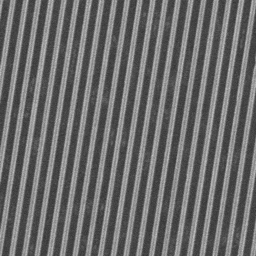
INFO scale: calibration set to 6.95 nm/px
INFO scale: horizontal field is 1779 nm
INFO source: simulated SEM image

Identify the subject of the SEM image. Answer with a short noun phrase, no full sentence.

parallel lines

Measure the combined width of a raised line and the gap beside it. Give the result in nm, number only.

87.3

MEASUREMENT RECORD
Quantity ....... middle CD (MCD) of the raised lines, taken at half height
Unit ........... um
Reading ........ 0.0301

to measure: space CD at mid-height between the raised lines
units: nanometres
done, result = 59.3